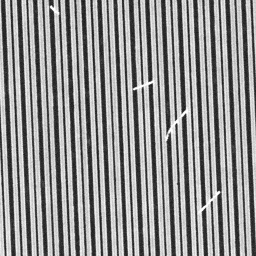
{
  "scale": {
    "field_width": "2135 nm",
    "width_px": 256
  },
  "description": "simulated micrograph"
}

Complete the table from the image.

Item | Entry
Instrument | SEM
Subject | parallel lines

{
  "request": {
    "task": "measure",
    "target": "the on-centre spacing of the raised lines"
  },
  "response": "66.8 nm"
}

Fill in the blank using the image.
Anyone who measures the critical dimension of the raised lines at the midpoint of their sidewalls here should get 0.0292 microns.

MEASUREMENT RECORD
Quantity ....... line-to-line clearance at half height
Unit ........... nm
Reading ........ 42.7